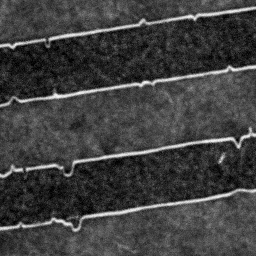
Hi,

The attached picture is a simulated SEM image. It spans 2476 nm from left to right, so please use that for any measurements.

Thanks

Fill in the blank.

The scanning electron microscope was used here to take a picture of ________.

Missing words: one or a few lines or trenches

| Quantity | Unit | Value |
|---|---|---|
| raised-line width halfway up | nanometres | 554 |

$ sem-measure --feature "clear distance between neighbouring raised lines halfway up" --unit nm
652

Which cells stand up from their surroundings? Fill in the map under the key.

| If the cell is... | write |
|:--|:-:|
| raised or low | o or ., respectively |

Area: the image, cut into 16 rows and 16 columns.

................
.........ooooooo
...ooooooooooooo
oooooooooooooooo
oooooooooooooo..
ooooooo.........
................
................
...............o
.........ooooooo
..oo.ooooooooooo
oooooooooooooooo
ooooooooooooo...
oooooo..........
................
................